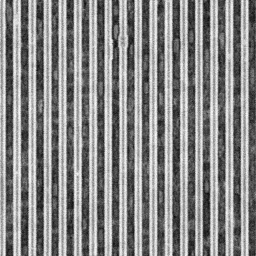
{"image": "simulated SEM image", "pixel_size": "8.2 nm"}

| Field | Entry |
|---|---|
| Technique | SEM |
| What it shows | parallel lines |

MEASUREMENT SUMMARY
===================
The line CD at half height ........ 44.1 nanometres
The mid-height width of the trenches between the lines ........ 0.082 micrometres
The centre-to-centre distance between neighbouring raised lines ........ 124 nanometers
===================